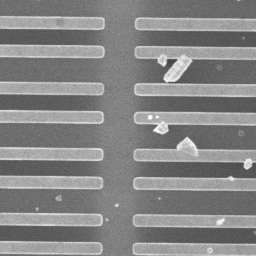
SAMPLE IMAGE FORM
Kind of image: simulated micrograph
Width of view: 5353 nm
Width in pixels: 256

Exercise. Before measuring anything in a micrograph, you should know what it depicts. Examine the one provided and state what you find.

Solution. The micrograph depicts groups of lines, slits or small figures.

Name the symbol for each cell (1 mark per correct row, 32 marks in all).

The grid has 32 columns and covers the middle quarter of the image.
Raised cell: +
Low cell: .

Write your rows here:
...........................++++.
..........................++++..
..........................++++..
.........................++++...
.........................+++....
++++++++++........++++++++++++++
++++++++++........++++++++++++++
+++++++++.........++++++++++++++
................................
................................
................................
................................
++++++++++........++++++++++++++
++++++++++........++++++++++++++
++++++++++........++++++++++++++
.......................+++......
.......................+++......
................................
................................
..............................++
............................++++
++++++++++........++++++++++++++
++++++++++........++++++++++++++
++++++++++........++++++++++++++
................................
................................
................................
................................
+++++++++.........++++++........
++++++++++.......+++++++++++++++
++++++++++.......+++++++++++++++
................................